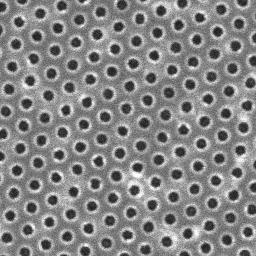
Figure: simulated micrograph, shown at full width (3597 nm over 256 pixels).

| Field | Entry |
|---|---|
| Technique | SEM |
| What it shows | a regular array of holes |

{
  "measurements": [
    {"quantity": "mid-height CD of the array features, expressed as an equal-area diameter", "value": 161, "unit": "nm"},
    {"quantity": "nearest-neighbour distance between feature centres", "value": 316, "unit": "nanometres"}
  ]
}